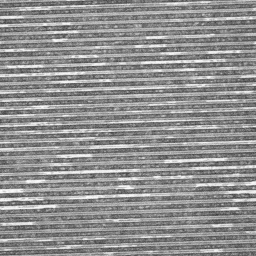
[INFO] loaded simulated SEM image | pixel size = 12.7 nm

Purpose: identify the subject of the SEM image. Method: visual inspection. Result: parallel lines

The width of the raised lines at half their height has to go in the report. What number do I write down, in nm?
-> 33.3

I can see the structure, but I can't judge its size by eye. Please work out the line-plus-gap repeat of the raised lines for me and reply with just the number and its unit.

105 nm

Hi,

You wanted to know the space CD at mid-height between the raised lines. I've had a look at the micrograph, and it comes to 0.065 micrometres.